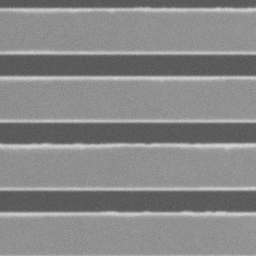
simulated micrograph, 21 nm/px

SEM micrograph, lines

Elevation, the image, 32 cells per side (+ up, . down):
................................
++++++++++++++++++++++++++++++++
++++++++++++++++++++++++++++++++
++++++++++++++++++++++++++++++++
++++++++++++++++++++++++++++++++
++++++++++++++++++++++++++++++++
++++++++++++++++++++++++++++++++
................................
................................
................................
++++++++++++++++++++++++++++++++
++++++++++++++++++++++++++++++++
++++++++++++++++++++++++++++++++
++++++++++++++++++++++++++++++++
++++++++++++++++++++++++++++++++
................................
................................
................................
++++++++++++++++++++++++++++++++
++++++++++++++++++++++++++++++++
++++++++++++++++++++++++++++++++
++++++++++++++++++++++++++++++++
++++++++++++++++++++++++++++++++
++++++++++++++++++++++++++++++++
................................
................................
................................
++++++++++++++++++++++++++++++++
++++++++++++++++++++++++++++++++
++++++++++++++++++++++++++++++++
++++++++++++++++++++++++++++++++
++++++++++++++++++++++++++++++++